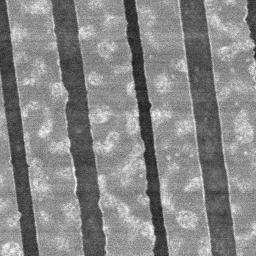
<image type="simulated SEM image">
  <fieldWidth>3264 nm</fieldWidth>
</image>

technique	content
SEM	one or a few lines or trenches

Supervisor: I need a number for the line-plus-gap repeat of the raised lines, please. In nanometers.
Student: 816